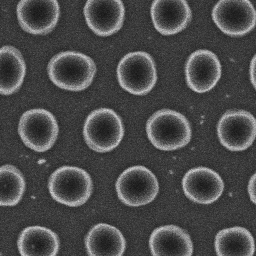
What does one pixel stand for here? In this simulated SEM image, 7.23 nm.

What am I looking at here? a regular array of raised bodies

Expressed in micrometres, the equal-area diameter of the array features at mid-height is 0.283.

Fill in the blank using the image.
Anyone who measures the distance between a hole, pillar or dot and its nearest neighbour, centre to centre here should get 469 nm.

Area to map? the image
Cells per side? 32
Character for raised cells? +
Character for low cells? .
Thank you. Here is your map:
...++++....++++....++++....++++.
..+++++....++++....+++++...+++++
...++++....++++....++++....+++++
...+++......+++.....+++....++++.
................................
................................
++..............................
+++....++++....++++.....+++.....
+++...++++++...++++....++++....+
+++...++++++...++++....++++....+
++.....++++....++++.....+++.....
+...............++..............
................................
................................
...+++.....++++....++++.....+++.
...++++....++++....++++....+++++
...++++....++++....+++++...+++++
...++++....++++....++++.....+++.
....++......++......++.......++.
................................
................................
++.....+++......+++.....++......
+++....++++....++++....+++++...+
+++...+++++....+++++...+++++...+
+++....++++....++++.....+++....+
++......+.......++..............
................................
................................
....+.......++......+...........
...++++....++++....++++....++++.
..+++++....++++....+++++...+++++
...++++....++++....+++++...+++++